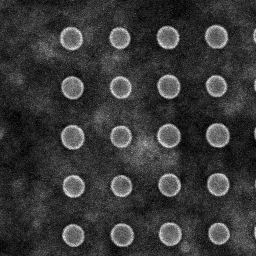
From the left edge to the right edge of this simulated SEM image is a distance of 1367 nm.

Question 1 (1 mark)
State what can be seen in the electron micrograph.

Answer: a regular array of raised bodies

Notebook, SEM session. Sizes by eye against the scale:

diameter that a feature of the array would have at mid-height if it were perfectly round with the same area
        117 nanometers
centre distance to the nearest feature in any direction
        257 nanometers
